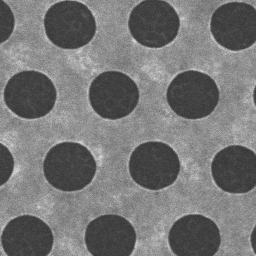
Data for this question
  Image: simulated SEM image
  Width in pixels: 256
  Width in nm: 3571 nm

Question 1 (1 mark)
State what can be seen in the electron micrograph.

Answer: holes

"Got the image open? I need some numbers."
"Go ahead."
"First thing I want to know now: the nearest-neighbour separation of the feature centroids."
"1120 nm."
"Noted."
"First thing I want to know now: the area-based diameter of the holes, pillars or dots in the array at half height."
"51.1 pixels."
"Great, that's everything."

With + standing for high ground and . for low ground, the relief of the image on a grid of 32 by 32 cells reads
.++++++...+++++++....+++++++...+
..++++.....+++++......+++++.....
..+++.......++++......++++......
..++++......++++......++++......
.+++++......++++......+++++.....
+++++++....++++++....++++++.....
++++++++++++++++++++++++++++++++
++++++++++++++++++++++++++++++++
++++++++++++++++++++++++++++++++
++....++++++....++++++....++++++
+......++++......++++......+++++
.......++++......++++......+++++
+......++++......++++......+++++
+......++++......++++......+++++
++...+++++++....++++++....++++++
++++++++++++++++++++++++++++++++
++++++++++++++++++++++++++++++++
++++++++++++++++++++++++++++++++
.+++++.....++++++....+++++++...+
..++++......++++......+++++.....
..+++.......++++......++++......
..+++.......++++......++++......
.+++++......+++++.....+++++.....
+++++++...++++++++...++++++.....
++++++++++++++++++++++++++++++++
++++++++++++++++++++++++++++++++
++++++++++++++++++++++++++++++++
+....+++++++....++++++....++++++
+.....+++++......++++......+++++
.......++++......++++.......+++.
.......++++......++++.......+++.
+.....+++++......+++++.....+++++